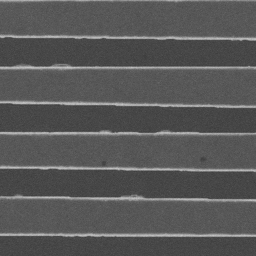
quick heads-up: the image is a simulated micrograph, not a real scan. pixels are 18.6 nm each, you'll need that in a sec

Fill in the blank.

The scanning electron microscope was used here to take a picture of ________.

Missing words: lines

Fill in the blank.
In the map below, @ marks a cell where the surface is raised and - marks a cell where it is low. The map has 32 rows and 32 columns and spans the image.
@@@@@@@@@@@@@@@@@@@@@@@@@@@@@@@@
@@@@@@@@@@@@@@@@@@@@@@@@@@@@@@@@
@@@@@@@@@@@@@@@@@@@@@@@@@@@@@@@@
@@@@@@@@@@@@@@@@@@@@@@@@@@@@@@@@
@@@@@@@@@@@@@@@@@@@@@@@@@@@@@@@@
--------------------------------
--------------------------------
--------------------------------
@@@@@@@@@@@@@@@@@@@@@@@@@@@@@@@@
@@@@@@@@@@@@@@@@@@@@@@@@@@@@@@@@
@@@@@@@@@@@@@@@@@@@@@@@@@@@@@@@@
@@@@@@@@@@@@@@@@@@@@@@@@@@@@@@@@
@@@@@@@@@@@@@@@@@@@@@@@@@@@@@@@@
--------------------------------
--------------------------------
--------------------------------
--------------------------------
@@@@@@@@@@@@@@@@@@@@@@@@@@@@@@@@
@@@@@@@@@@@@@@@@@@@@@@@@@@@@@@@@
@@@@@@@@@@@@@@@@@@@@@@@@@@@@@@@@
@@@@@@@@@@@@@@@@@@@@@@@@@@@@@@@@
--------------------------------
--------------------------------
--------------------------------
--------------------------------
@@@@@@@@@@@@@@@@@@@@@@@@@@@@@@@@
@@@@@@@@@@@@@@@@@@@@@@@@@@@@@@@@
@@@@@@@@@@@@@@@@@@@@@@@@@@@@@@@@
@@@@@@@@@@@@@@@@@@@@@@@@@@@@@@@@
----------------@@-@-@@@@@@@@@@@
--------------------------------
--------------------------------